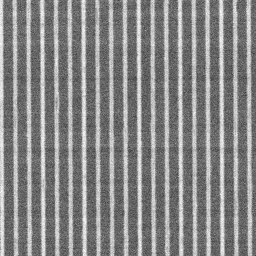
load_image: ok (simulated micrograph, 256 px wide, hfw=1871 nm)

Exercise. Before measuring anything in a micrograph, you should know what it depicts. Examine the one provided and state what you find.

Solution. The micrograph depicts parallel lines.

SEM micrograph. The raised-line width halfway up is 17.4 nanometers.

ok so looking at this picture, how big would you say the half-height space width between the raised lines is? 85 nm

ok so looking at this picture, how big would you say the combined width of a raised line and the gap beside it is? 101 nm